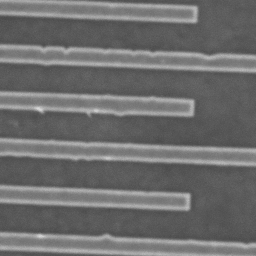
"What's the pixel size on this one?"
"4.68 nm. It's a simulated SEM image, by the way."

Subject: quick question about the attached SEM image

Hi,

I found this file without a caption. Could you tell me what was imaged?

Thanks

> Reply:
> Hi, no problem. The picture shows parallel lines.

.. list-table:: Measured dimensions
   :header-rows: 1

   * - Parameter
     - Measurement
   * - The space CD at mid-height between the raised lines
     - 33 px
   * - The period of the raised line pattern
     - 220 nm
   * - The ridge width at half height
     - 0.066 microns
